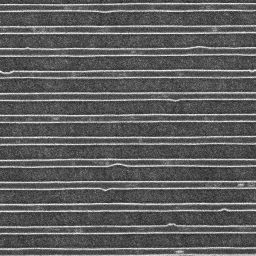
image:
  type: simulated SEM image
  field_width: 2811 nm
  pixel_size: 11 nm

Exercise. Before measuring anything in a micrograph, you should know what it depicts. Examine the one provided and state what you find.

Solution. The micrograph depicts parallel lines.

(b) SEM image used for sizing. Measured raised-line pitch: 244 nm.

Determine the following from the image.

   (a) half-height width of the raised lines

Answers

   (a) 0.0851 microns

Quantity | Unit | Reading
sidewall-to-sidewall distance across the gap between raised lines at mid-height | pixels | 14.7